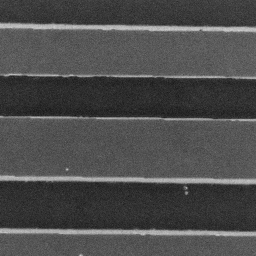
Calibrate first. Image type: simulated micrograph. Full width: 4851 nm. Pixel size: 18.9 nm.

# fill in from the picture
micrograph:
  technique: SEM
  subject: lines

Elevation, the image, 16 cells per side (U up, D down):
DDDDDDDDDDDDDDDD
DDDDDDDDDDDDDDDD
UUUUUUUUUUUUUUUU
UUUUUUUUUUUUUUUU
UUUUUUUUUUUUUUUU
DDDDDDDDDDDDDDDD
DDDDDDDDDDDDDDDD
UUUUUUUUUUUUUUUU
UUUUUUUUUUUUUUUU
UUUUUUUUUUUUUUUU
UUUUUUUUUUUUUUUU
DDDDDDDDDDDDDDDD
DDDDDDDDDDDDDDDD
DDDDDDDDDDDDDDDD
DDDDDDDDDDDDDDDD
UUUUUUUUUUUUUUUU